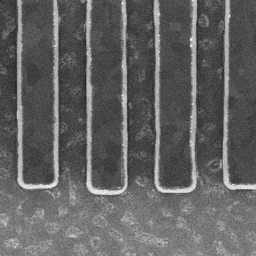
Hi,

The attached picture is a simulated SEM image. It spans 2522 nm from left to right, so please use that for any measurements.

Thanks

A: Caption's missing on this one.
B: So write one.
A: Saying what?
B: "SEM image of one or a few lines or trenches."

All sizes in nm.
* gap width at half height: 312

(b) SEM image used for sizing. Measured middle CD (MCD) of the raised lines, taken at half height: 371 nm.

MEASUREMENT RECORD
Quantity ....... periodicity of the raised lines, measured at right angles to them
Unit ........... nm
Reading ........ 677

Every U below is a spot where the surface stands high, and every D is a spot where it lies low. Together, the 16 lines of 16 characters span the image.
DUUDDDUUDDUUDDUU
DUUUDDUUDDUUDDUU
DUUUDUUUDDUUDDUU
DUUUDDUUDDUUDDUU
DUUUDDUUDDUUDDUU
DUUDDDUUDDUUDDUU
DUUUDDUUDDUUDDUU
DUUUDDUUDDUUDDUU
DUUUDDUUDDUUDDUU
DUUDDDUUDDUUDDUU
DUUDDDUUDDUUDDUU
DUUDDDUUDDUUDDUU
DDDDDDDDDDDDDDDD
DDDDDDDDDDDDDDDD
DDDDDDDDDDDDDDDD
DDDDDDDDDDDDDDDD